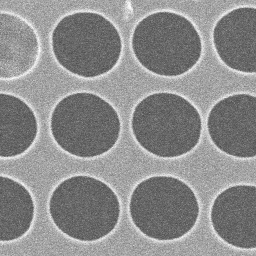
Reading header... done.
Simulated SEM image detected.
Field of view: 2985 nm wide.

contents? holes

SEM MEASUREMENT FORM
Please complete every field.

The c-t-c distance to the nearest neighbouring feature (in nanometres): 934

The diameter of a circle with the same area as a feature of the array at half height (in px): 67.5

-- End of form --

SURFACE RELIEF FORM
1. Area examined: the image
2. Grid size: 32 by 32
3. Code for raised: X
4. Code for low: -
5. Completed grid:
XXXXXXXXXXXXXXXXXXXXXXXXXXXXXXXX
XXXXXXXXXX-XXXXXXXXX-XXXXXXXX---
XXXXXXXX------XXXX------XXX-----
XXXXXXX-------XXX-------XXX-----
XXXXXX---------XX--------XX-----
-XXXXX---------X---------XX-----
-XXXXXX--------XX--------XX-----
-XXXXXX--------XX--------XXX----
XXXXXXXX------XXXX------XXXXX---
XXXXXXXXXX--XXXXXXXXX-XXXXXXXXXX
XXXXXXXXXXXXXXXXXXXXXXXXXXXXXXXX
XXXXXXXXXXXXXXXXXXXX-XXXXXXXXXXX
---XXXXX-----XXXXX-----XXXXX----
----XXX-------XXX-------XXX-----
----XX---------XX--------X------
-----X---------X---------X------
-----X---------XX--------X------
----XXX--------XX--------X------
----XXXX------XXXX------XXX-----
--XXXXXXX---XXXXXXXX--XXXXXXX---
XXXXXXXXXXXXXXXXXXXXXXXXXXXXXXXX
XXXXXXXXXXXXXXXXXXXXXXXXXXXXXXXX
--XXXXXX----XXXXXX----XXXXXXXXXX
---XXXX-------XXX-------XXXXX---
----XX---------X--------XXX-----
----XX---------X---------XX-----
----XX---------X---------X------
----XXX--------X---------X------
----XXX-------XXX-------XXX-----
---XXXXX-----XXXXX-----XXXX-----
XXXXXXXXXXXXXXXXXXXXXXXXXXXXX---
XXXXXXXXXXXXXXXXXXXXXXXXXXXXXXXX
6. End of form